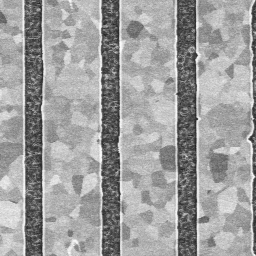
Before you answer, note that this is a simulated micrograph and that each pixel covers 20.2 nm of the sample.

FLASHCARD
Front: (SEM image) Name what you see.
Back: one or a few lines or trenches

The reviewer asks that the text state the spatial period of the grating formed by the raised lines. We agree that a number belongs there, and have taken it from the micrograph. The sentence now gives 1540 nm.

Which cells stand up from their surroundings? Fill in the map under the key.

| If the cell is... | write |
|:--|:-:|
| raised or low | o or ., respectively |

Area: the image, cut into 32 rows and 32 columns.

ooo..oooooooo..ooooooo...ooooooo
ooo..oooooooo..ooooooo...oooooo.
ooo..oooooooo..ooooooo...oooooo.
ooo..oooooooo..ooooooo...oooooo.
ooo..oooooooo..ooooooo...oooooo.
ooo..oooooooo..ooooooo...oooooo.
ooo..oooooooo..ooooooo...oooooo.
ooo..oooooooo..ooooooo...oooooo.
ooo...ooooooo..ooooooo...oooooo.
ooo...ooooooo..ooooooo...oooooo.
ooo..oooooooo..ooooooo...ooooooo
ooo..oooooooo..ooooooo...ooooooo
ooo..oooooooo..ooooooo...ooooooo
ooo..oooooooo..ooooooo...oooooo.
ooo..oooooooo..ooooooo...ooooooo
ooo..oooooooo..ooooooo...ooooooo
ooo..oooooooo..ooooooo...oooooo.
ooo..ooooooo...ooooooo...oooooo.
ooo..oooooooo..ooooooo...oooooo.
ooo..oooooooo..ooooooo...oooooo.
ooo..oooooooo..ooooooo...oooooo.
ooo..ooooooo...ooooooo...oooooo.
ooo..oooooooo..ooooooo...ooooooo
ooo..oooooooo..ooooooo...oooooo.
ooo..oooooooo..ooooooo...oooooo.
ooo..oooooooo..ooooooo...oooooo.
ooo...ooooooo..ooooooo...ooooooo
ooo...ooooooo..ooooooo...ooooooo
ooo...ooooooo..ooooooo...ooooooo
ooo..oooooooo..ooooooo...ooooooo
ooo..oooooooo..ooooooo...ooooooo
ooo..oooooooo..ooooooo...ooooooo